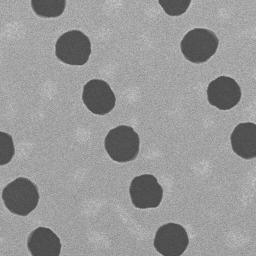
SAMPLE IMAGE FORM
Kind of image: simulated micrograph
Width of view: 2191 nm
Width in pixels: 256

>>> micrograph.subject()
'holes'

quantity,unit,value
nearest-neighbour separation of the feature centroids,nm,460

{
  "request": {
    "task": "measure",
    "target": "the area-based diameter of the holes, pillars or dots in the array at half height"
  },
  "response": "302 nm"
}